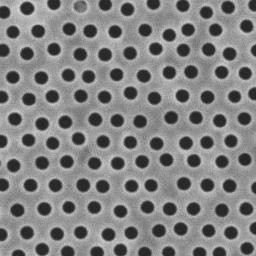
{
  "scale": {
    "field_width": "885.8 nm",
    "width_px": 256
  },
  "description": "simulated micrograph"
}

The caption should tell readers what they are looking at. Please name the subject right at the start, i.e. a regular array of holes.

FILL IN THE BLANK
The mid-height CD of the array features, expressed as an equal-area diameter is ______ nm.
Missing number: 48.1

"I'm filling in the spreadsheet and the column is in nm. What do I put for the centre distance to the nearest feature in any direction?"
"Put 78.3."